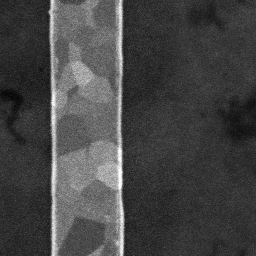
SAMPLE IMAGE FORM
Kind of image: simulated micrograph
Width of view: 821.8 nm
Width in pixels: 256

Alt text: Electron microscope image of one or a few lines or trenches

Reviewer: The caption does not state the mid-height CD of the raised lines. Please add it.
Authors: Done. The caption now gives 217 nm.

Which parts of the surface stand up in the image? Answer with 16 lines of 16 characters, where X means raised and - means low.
---XXXX---------
---XXXX---------
---XXXX---------
---XXXX---------
---XXXXX--------
---XXXXX--------
---XXXX---------
---XXXX---------
---XXXX---------
---XXXX---------
---XXXX---------
---XXXX---------
---XXXXX--------
---XXXXX--------
---XXXXX--------
---XXXXX--------